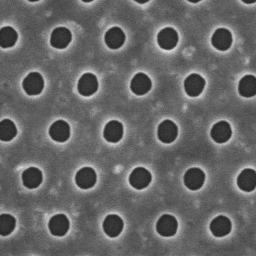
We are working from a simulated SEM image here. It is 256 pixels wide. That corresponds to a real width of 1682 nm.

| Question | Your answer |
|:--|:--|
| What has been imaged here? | a regular array of holes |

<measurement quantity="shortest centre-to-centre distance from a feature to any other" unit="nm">353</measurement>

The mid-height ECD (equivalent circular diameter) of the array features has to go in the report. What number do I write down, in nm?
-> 149